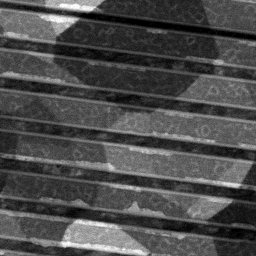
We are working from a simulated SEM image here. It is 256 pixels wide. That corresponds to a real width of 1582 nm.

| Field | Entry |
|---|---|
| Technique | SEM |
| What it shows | parallel lines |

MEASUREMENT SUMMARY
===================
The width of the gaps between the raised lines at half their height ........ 80.5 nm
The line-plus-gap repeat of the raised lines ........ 247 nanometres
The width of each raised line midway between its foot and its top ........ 167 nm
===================